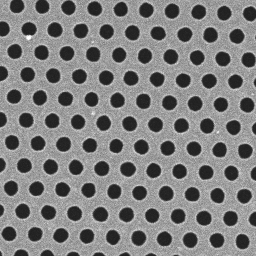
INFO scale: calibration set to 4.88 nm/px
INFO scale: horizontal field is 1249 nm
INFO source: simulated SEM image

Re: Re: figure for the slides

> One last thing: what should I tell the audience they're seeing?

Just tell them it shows a regular array of holes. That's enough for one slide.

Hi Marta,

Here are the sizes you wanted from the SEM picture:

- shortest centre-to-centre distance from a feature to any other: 125 nm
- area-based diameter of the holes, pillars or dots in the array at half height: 0.0713 microns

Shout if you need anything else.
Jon